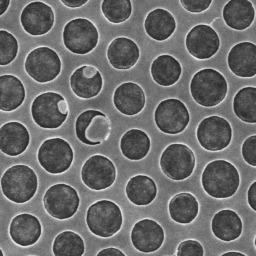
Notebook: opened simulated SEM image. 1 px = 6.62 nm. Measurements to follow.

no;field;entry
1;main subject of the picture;a regular array of holes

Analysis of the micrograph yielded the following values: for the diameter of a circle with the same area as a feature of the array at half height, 0.225 micrometres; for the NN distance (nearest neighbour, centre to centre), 45.7 px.